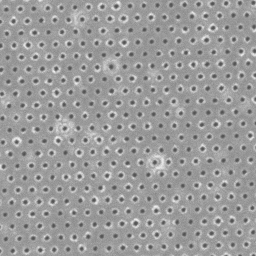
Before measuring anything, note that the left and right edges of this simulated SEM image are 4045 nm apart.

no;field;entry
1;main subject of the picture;a regular array of holes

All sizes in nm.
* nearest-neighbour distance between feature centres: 210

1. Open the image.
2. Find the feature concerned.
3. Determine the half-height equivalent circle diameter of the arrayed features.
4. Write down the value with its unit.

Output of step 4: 81.7 nanometres